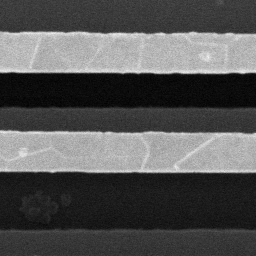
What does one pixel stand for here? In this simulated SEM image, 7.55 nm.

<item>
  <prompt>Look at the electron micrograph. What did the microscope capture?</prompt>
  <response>lines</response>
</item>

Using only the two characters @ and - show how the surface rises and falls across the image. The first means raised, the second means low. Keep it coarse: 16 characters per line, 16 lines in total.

@@@@@@@@@@@@@@@@
@@@@@@@@@@@@@@@@
@@@@@@@@@@@@@@@@
@@@@@@@@@@@@@@@@
@@@@@@@@@@@@@@@@
----------------
----------------
@@@@@@@@@@@@@@@@
@@@@@@@@@@@@@@@@
@@@@@@@@@@@@@@@@
@@@@@@@@@@@@@@@@
----------------
----------------
----------------
@@@@@@@@@@@@@@@@
@@@@@@@@@@@@@@@@